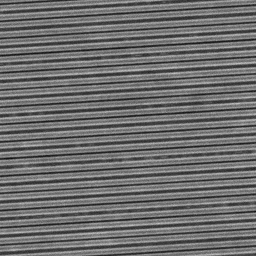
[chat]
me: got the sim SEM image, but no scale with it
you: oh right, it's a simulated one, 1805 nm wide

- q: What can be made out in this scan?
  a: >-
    parallel lines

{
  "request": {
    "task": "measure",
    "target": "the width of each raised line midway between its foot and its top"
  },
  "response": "37.8 nm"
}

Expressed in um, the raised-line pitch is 0.0605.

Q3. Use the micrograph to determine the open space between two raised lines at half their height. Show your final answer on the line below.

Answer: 19.3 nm